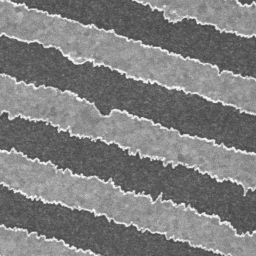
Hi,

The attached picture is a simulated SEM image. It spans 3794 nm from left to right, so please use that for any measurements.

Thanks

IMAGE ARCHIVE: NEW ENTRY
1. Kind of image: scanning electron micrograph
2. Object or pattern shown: one or a few lines or trenches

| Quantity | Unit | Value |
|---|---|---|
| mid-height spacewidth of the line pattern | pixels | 38.6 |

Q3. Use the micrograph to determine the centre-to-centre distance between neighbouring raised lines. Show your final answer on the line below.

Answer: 1.06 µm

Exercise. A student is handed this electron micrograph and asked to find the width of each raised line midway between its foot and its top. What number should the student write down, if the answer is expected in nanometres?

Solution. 489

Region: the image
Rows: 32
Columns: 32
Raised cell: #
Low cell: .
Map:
##................############..
######..............############
#########............#...#######
############...............#####
.##############.................
.....#############..............
........#############...........
.........###############........
..............#############.....
#...............##############..
###.................############
#########..............#########
##########................######
############..................##
.################...............
......##############............
.........#############..........
.............#############......
................############....
###...............##############
######...............###########
#########................#######
#############..............#.###
.##############................#
...###############..............
........##############..........
............#############.......
..............#############.....
#................############...
#####................###########
########................########
###########................#####